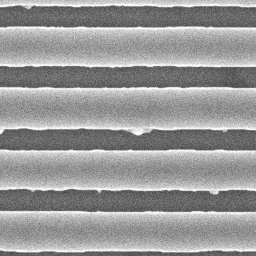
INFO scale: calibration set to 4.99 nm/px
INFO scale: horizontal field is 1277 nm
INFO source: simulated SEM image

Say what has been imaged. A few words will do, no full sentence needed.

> lines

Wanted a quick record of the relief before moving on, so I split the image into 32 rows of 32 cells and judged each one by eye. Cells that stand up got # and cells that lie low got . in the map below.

################################
................................
................................
.######..##..........#####......
################################
################################
################################
################################
................................
................................
................................
################################
################################
################################
################################
################################
.................#..............
................................
................................
################################
################################
################################
################################
################################
................................
................................
###########.#.....#....###......
################################
################################
################################
################################
................................